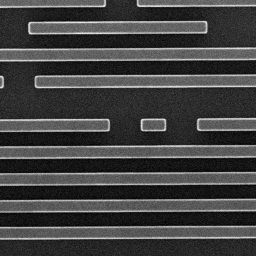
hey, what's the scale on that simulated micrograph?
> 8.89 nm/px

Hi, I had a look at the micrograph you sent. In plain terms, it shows groups of lines, slits or small figures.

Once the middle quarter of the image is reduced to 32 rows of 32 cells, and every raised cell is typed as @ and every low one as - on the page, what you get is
--------------------------------
--------------------------------
--------------------------------
@@@@@@@@@@@@@@@@@@@@@@@@@@@@@@@@
@@@@@@@@@@@@@@@@@@@@@@@@@@@@@@@@
@@@@@@@@@@@@@@@@@@@@@@@@@@@@@@@@
--------------------------------
--------------------------------
--------------------------------
--------------------------------
--------------------------------
--------------------------------
--------------------------------
--------------------------------
@@@@@@@@@@@--------@@@@@@-------
@@@@@@@@@@@--------@@@@@@-------
@@@@@@@@@@@--------@@@@@@-------
--------------------------------
--------------------------------
--------------------------------
--------------------------------
@@@@@@@@@@@@@@@@@@@@@@@@@@@@@@@@
@@@@@@@@@@@@@@@@@@@@@@@@@@@@@@@@
@@@@@@@@@@----------------------
--------------------------------
--------------------------------
--------------------------------
@@@@@@@@@@@@@@@@@@@@@@@@@@@@@@@@
@@@@@@@@@@@@@@@@@@@@@@@@@@@@@@@@
@@@@@@@@@@@@@@@@@@@@@@@@@@@@@@@@
--------------------------------
--------------------------------